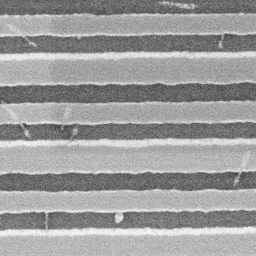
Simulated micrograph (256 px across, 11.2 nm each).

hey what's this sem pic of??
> lines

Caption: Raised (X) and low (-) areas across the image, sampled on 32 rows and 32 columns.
--------------------------------
--------------------------------
XXXXXXXXXXXXXXXXXXXXXXXXXXXXXXXX
XXXXXXXXXXXXXXXXXXXXXXXXXXXXXXXX
XXXX---XXX----------------------
--------------------------------
--------------------------------
XXXXXXXXXXXXXXXXXXXXXXXXXXXXXXXX
XXXXXXXXXXXXXXXXXXXXXXXXXXXXXXXX
XXXXXXXXXXXXXXXXXXXXXXXXXXXXXXXX
XXXXXXX-XX--X--X-XX--X----------
--------------------------------
--------------------------------
XXXXXXXXXXXXXXXXXXXXXXXXXXXXXXXX
XXXXXXXXXXXXXXXXXXXXXXXXXXXXXXXX
--X----X---X--------------------
--------------------------------
--------------------------------
XXXXXXXXXXXXXXXXXXXXXXXXXXXXXXXX
XXXXXXXXXXXXXXXXXXXXXXXXXXXXXXXX
XXXXXXXXXXXXXXXXXXXXXXXXXXXXXXXX
XXXXXXXXXXXXXXXXXX-XX-XXXXXX-X--
--------------------------------
--------------------------------
XXXXXXXXXXXXXXXXXXXXXXXXXXXXXXXX
XXXXXXXXXXXXXXXXXXXXXXXXXXXXXXXX
XXX-----------X-----------------
--------------------------------
--------------------------------
XXXXXXXXXXXXXXXXXXXXXXXXXXXXXXXX
XXXXXXXXXXXXXXXXXXXXXXXXXXXXXXXX
XXXXXXXXXXXXXXXXXXXXXXXXXXXXXXXX